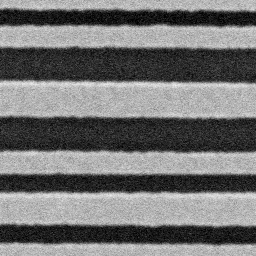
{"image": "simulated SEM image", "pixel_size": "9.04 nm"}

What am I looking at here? lines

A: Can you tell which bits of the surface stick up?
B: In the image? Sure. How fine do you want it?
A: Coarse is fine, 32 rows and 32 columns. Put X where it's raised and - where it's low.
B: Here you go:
XXXXXXXXXXXXXXXXXXXXXXXXXXXXXXXX
--------------------------------
--------------------------------
XXXXXXXXXXXXXXXXXXXXXXXXXXXXXXXX
XXXXXXXXXXXXXXXXXXXXXXXXXXXXXXXX
XXXXXXXXXXXXXXXXXXXXXXXXXXXXXXXX
--------------------------------
--------------------------------
--------------------------------
--------------------------------
XXXXXXXXXXXXXXXXXXXXXX--X-----X-
XXXXXXXXXXXXXXXXXXXXXXXXXXXXXXXX
XXXXXXXXXXXXXXXXXXXXXXXXXXXXXXXX
XXXXXXXXXXXXXXXXXXXXXXXXXXXXXXXX
----XXX-XXX-XXXXXXXXXXXXXXXXXXXX
--------------------------------
--------------------------------
--------------------------------
--------------------------------
XXXXXXXXXXXXXXXXXXXXXXXXXXXXXXXX
XXXXXXXXXXXXXXXXXXXXXXXXXXXXXXXX
XXXXXXXXXXXXXXXXXXXXXXXXXXXXXXXX
--------------------------------
--------------------------------
XXXXXXXXXXXXXXXXXXXXXXXXXXXXXXXX
XXXXXXXXXXXXXXXXXXXXXXXXXXXXXXXX
XXXXXXXXXXXXXXXXXXXXXXXXXXXXXXXX
XXXXXXXXXXXXXXXXXXXXXXXXXXXXXXXX
--------------------------------
--------------------------------
--------------------------------
XXXXXXXXXXXXXXXXXXXXXXXXXXXXXXXX